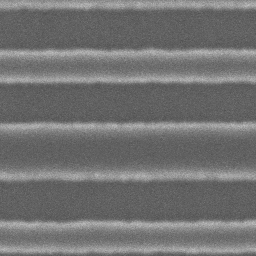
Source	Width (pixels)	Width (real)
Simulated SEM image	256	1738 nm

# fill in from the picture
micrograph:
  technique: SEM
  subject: lines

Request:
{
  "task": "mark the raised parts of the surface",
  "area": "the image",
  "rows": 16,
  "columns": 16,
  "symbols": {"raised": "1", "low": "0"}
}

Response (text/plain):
0000000000000000
0000000000000000
0000000000000000
1111111111111111
1111111111111111
0000000000000000
0000000000000000
0000000000000000
1111111111111111
1111111111111111
1111111111111111
0000000000000000
0000000000000000
0000000000000000
1111111111111111
1111111111111111